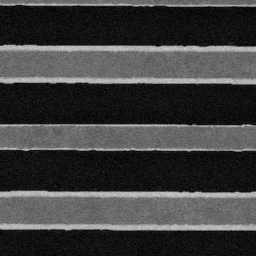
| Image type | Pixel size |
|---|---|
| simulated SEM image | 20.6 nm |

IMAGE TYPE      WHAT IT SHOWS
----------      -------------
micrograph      lines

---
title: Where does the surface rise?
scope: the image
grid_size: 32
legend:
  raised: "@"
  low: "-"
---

@@@@@@@@@@@@@@@@@@@@@@@@@@@@@@@@
--------------------------------
--------------------------------
--------------------------------
--------------------------------
--------------------------------
@@@@@@@@@@@@@@@@@@@@@@@@@@@@@@@@
@@@@@@@@@@@@@@@@@@@@@@@@@@@@@@@@
@@@@@@@@@@@@@@@@@@@@@@@@@@@@@@@@
@@@@@@@@@@@@@@@@@@@@@@@@@@@@@@@@
--------------------------------
--------------------------------
--------------------------------
--------------------------------
--------------------------------
--------------------------------
@@@@@@@@@@@@@@@@@@@@@@@@@@@@@@@@
@@@@@@@@@@@@@@@@@@@@@@@@@@@@@@@@
@@@@@@@@@@@@@@@@@@@@@@@@@@@@@@@@
--------------------------------
--------------------------------
--------------------------------
--------------------------------
--------------------------------
@@@@@@@@@@@@@@@@@@@@@@@@@@@@@@@@
@@@@@@@@@@@@@@@@@@@@@@@@@@@@@@@@
@@@@@@@@@@@@@@@@@@@@@@@@@@@@@@@@
@@@@@@@@@@@@@@@@@@@@@@@@@@@@@@@@
----------------@--@@-@@@@@@-@--
--------------------------------
--------------------------------
--------------------------------